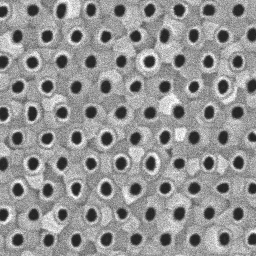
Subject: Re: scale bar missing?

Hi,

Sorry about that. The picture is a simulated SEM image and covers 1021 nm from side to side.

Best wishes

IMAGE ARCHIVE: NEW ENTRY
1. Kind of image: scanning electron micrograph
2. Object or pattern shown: a regular array of holes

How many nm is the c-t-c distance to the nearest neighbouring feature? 114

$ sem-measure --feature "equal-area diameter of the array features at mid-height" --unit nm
45